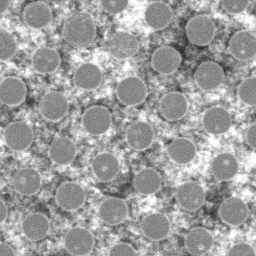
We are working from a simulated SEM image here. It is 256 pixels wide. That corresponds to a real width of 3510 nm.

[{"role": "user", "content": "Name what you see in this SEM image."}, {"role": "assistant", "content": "a regular array of raised bodies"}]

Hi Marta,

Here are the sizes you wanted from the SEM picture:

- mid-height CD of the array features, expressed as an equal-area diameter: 392 nm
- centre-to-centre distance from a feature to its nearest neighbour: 618 nm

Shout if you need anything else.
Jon